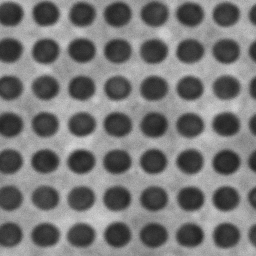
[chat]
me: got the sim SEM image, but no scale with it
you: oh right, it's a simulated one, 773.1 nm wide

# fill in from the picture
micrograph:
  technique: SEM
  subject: a regular array of holes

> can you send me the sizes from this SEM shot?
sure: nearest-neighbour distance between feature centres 36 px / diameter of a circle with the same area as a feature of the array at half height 26.4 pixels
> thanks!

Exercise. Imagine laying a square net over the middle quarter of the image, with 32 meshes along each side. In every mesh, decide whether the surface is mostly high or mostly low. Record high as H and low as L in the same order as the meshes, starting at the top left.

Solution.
HHHHHHHHHHHHHHHHHHHHHHHHHHHHHHHH
HHHHHHHHHHHHHHHHHHHHHHHHHHHHHHHH
HHHHHHHHHHHHHHHHHHHHHHHHHHHHHHHH
HHHLLLLHHHHHLLLHHHHHLLLLLHHHHLLL
HHLLLLLHHHLLLLLLHHHHLLLLLLHHLLLL
HLLLLLLLHHLLLLLLLHHLLLLLLLHHLLLL
HLLLLLLLHHLLLLLLLHHLLLLLLLHHLLLL
HLLLLLLLHHLLLLLLHHHLLLLLLLHHLLLL
HHLLLLLHHHHLLLLLHHHHLLLLLHHHHLLL
HHHHHHHHHHHHHHHHHHHHHHHHHHHHHHHH
HHHHHHHHHHHHHHHHHHHHHHHHHHHHHHHH
HHHHHHHHHHHHHHHHHHHHHHHHHHHHHHHH
HHHLLLLHHHHLLLLHHHHHHLLLLHHHHHLL
HHLLLLLLHHLLLLLLHHHHLLLLLLHHLLLL
HLLLLLLLHHLLLLLLLHHLLLLLLLHHLLLL
HLLLLLLLHHLLLLLLLHHLLLLLLLHHLLLL
HLLLLLLLHHLLLLLLLHHLLLLLLLHHLLLL
HHLLLLLHHHHLLLLLHHHHLLLLLHHHHLLL
HHHHHHHHHHHHHHHHHHHHHHLHHHHHHHHL
HHHHHHHHHHHHHHHHHHHHHHHHHHHHHHHH
HHHHHHHHHHHHHHHHHHHHHHHHHHHHHHHH
HHHLLHHHHHHHHLHHHHHHHLLLHHHHHHHL
HHLLLLLHHHHLLLLLHHHHLLLLLHHHHLLL
HLLLLLLLHHLLLLLLLHHLLLLLLLHHLLLL
HLLLLLLLHHLLLLLLLHHLLLLLLLHHLLLL
HLLLLLLLHHLLLLLLLHHLLLLLLLHHLLLL
HHLLLLLHHHHLLLLLHHHHLLLLLHHHHLLL
HHHHLHHHHHHHLHHHHHHHHHHHHHHHHHLL
HHHHHHHHHHHHHHHHHHHHHHHHHHHHHHHH
HHHHHHHHHHHHHHHHHHHHHHHHHHHHHHHH
HHHHLHHHHHHHHLHHHHHHHHLHHHHHHHHH
HHLLLLLHHHLLLLLLHHHHLLLLLHHHHLLL